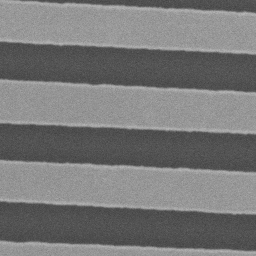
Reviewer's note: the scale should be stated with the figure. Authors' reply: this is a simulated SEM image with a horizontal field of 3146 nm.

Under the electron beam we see lines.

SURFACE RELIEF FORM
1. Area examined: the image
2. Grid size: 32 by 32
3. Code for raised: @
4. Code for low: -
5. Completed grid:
@@@@@@@@------------------------
@@@@@@@@@@@@@@@@@@@@@@@@@@@@----
@@@@@@@@@@@@@@@@@@@@@@@@@@@@@@@@
@@@@@@@@@@@@@@@@@@@@@@@@@@@@@@@@
@@@@@@@@@@@@@@@@@@@@@@@@@@@@@@@@
------@@@@@@@@@@@@@@@@@@@@@@@@@@
---------------------------@@@@@
--------------------------------
--------------------------------
--------------------------------
@@@@@@@@@-----------------------
@@@@@@@@@@@@@@@@@@@@@@@@@@@@@@@-
@@@@@@@@@@@@@@@@@@@@@@@@@@@@@@@@
@@@@@@@@@@@@@@@@@@@@@@@@@@@@@@@@
@@@@@@@@@@@@@@@@@@@@@@@@@@@@@@@@
-----@@@@@@@@@@@@@@@@@@@@@@@@@@@
----------------------------@@@@
--------------------------------
--------------------------------
--------------------------------
@@@@@@@-------------------------
@@@@@@@@@@@@@@@@@@@@@@@@@@@@@@--
@@@@@@@@@@@@@@@@@@@@@@@@@@@@@@@@
@@@@@@@@@@@@@@@@@@@@@@@@@@@@@@@@
@@@@@@@@@@@@@@@@@@@@@@@@@@@@@@@@
--------@@@@@@@@@@@@@@@@@@@@@@@@
--------------------------@@@@@@
--------------------------------
--------------------------------
--------------------------------
@@@@@@@@@-----------------------
@@@@@@@@@@@@@@@@@@@@@@@@@@@@@@@@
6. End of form